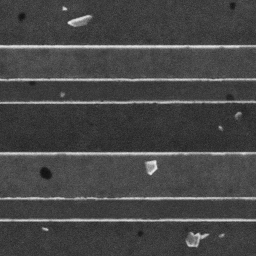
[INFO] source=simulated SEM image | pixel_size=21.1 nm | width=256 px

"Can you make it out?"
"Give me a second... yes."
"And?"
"lines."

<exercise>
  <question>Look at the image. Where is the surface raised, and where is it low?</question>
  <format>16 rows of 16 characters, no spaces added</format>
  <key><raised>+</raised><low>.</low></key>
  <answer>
................
................
................
++++++++++++++++
++++++++++++++++
++++++++++++++++
................
................
................
................
++++++++++++++++
++++++++++++++++
++++++++++++++++
++++++++++++++++
................
................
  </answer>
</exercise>